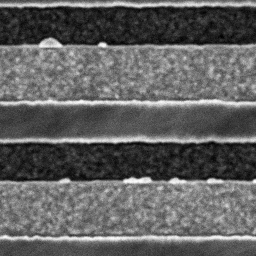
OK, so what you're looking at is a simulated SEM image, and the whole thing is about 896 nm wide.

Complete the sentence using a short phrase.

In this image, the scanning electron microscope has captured lines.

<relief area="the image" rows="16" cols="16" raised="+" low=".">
................
................
................
++++++++++++++++
++++++++++++++++
++++++++++++++++
++++++++++++++++
++++++++++++++++
++++++++++++++++
................
................
++++++++++++++++
++++++++++++++++
++++++++++++++++
++++++++++++++++
++++++++++++++++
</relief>